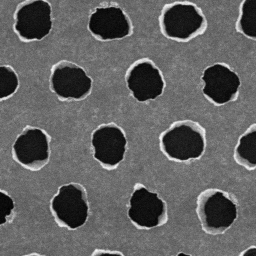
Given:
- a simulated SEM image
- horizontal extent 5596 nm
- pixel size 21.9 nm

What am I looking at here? a regular array of holes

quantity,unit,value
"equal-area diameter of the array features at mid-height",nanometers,811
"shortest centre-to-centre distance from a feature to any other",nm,1520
